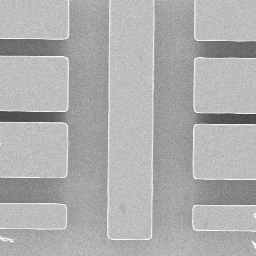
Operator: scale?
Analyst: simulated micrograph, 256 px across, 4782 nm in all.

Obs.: groups of lines, slits or small figures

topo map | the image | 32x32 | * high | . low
*********.....*****.....********
*********.....*****.....********
*********.....*****.....********
*********.....*****.....********
********......*****.....********
..............*****.............
..............*****.............
********......*****.....********
*********.....*****.....********
*********.....*****.....********
********......*****.....********
********......*****.....********
********......*****.....********
********......*****.....********
..............*****.............
********......*****.............
********......*****.....********
********......*****.....********
********......*****.....********
********......*****.....********
********......*****.....********
********......*****.....********
..............*****.............
..............*****.............
..............*****.............
********......*****.............
********.....******.....********
********.....******.....********
********.....******.....********
..............*****.............
................................
................................